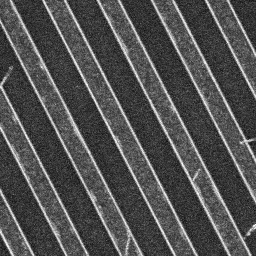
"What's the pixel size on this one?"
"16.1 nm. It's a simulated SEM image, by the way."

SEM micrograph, parallel lines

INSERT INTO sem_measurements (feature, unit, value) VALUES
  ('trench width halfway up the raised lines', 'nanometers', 472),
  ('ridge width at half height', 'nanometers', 309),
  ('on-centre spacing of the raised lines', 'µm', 0.774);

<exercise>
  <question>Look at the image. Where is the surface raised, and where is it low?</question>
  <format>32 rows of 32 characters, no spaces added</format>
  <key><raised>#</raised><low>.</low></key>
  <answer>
##....##....###....###....###...
##....###....###....##....###...
###....##....###....###....###..
###....###....###....##.....##..
.###....##.....##....###....###.
.###....###....###....###....##.
..###....##.....##....###....###
..###....###....###....###....##
...###....##.....##....###....##
....##....###....###....###....#
....###....###....##....###....#
.....##....###....###....###....
#....###....###....##....###....
##....##....###....###....###...
##....###....###....##....###...
###....##....###....###....###..
###....###....###....##.....##..
.###....##....###....###....###.
.###....###....###....##.....##.
..###....##.....##....###....###
..###....###....###....##.....##
...###....##.....##....###....##
....##....###....###....##.....#
....###....##.....##....###....#
.....##....###....###....##.....
#....###....##.....##....###....
#.....##....###....###....##....
##....###....##.....##....###...
##.....##....###....###....###..
###....###....##.....##....###..
.##.....##....###....###....###.
.###....###....###....##....###.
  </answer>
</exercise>